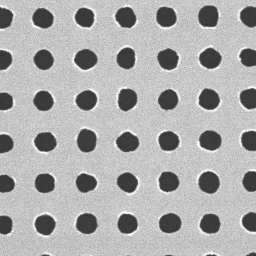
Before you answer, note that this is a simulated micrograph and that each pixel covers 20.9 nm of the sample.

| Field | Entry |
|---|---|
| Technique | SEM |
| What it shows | a regular array of holes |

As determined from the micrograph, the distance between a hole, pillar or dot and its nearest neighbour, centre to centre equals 849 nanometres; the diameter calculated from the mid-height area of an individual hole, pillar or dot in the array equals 0.446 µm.